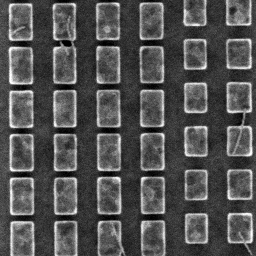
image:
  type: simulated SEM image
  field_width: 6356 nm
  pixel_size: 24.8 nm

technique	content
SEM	wiring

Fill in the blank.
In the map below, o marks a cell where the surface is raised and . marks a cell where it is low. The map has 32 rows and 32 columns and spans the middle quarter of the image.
ooo.....oooooo.....oooooo.....oo
ooo.....oooooo.....oooooo.......
ooo.....oooooo.....oooooo.......
ooo.....oooooo.....oooooo.......
ooo......ooooo......oooo........
..............................oo
..............................oo
ooo.....oooooo.....oooooo.....oo
ooo.....oooooo.....oooooo.....oo
ooo.....oooooo.....oooooo.....oo
ooo.....oooooo.....oooooo.....oo
ooo.....oooooo.....oooooo.....oo
ooo.....oooooo.....oooooo.......
ooo......ooooo.....oooooo.......
ooo......ooooo.....oooooo.......
ooo......ooooo......oooo........
..............................oo
....................ooooo.....oo
ooo......ooooo.....oooooo.....oo
ooo......ooooo.....oooooo.....oo
ooo......ooooo.....oooooo.....oo
ooo......ooooo.....oooooo.....oo
ooo......ooooo.....oooooo.....oo
ooo......ooooo.....oooooo.......
ooo......ooooo.....oooooo.......
ooo......ooooo.....oooooo.......
ooo......ooooo......oo..........
..............................oo
.........ooooo......ooooo.....oo
ooo......ooooo......ooooo.....oo
ooo......ooooo......ooooo.....oo
ooo......ooooo.....oooooo.....oo